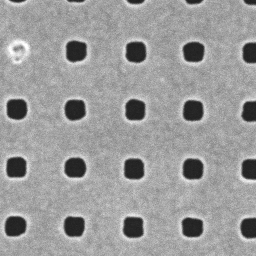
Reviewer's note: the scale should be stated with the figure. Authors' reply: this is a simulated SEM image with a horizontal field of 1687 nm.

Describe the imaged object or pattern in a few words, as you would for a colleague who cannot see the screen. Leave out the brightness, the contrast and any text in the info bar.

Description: a regular array of holes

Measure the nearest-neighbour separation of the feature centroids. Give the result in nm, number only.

384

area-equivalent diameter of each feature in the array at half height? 22.3 px